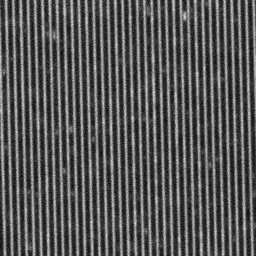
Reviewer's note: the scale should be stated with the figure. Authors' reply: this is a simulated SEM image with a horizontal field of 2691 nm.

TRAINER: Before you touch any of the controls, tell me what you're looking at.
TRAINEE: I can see parallel lines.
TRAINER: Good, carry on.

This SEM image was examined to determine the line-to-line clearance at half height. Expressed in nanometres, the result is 56.5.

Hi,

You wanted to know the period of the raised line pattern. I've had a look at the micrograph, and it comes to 76.5 nm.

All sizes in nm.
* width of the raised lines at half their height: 15.8